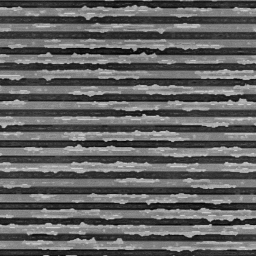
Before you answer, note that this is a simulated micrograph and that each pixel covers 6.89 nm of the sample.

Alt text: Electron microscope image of parallel lines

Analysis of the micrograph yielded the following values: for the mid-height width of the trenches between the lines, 50 nm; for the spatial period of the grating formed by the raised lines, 107 nanometers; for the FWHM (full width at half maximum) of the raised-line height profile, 8.13 pixels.